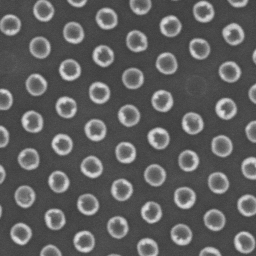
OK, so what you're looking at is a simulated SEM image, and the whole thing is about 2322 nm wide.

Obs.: a regular array of raised bodies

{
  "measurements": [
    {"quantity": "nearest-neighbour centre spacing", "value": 329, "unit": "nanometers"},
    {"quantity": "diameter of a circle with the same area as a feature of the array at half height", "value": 180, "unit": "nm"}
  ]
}